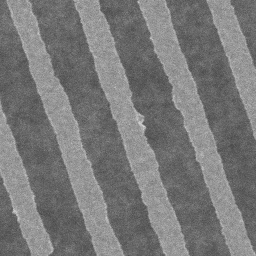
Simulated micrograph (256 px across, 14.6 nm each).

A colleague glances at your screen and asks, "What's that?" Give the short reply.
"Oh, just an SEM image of one or a few lines or trenches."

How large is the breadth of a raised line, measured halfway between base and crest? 0.333 um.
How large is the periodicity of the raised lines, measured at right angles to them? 922 nanometres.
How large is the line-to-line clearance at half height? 582 nm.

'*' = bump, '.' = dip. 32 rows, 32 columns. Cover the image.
.***......**.....****.....***...
.***......***.....***.....***...
..***.....***.....***......***..
..***.....****.....***.....***..
..***......***.....***.....***..
...**......***.....***......***.
...***.....****.....***.....***.
....**......***.....***......**.
....***.....***......**......***
....***.....****.....***.....***
.....***.....***.....***......**
.....***.....***......***.....**
.....***......**......***.....**
......***.....***.....***......*
*.....***.....****.....***.....*
*.....****.....***.....***.....*
*......***.....***......**......
**.....***.....***......***.....
**......**......***.....***.....
**......***.....***......**.....
***.....***.....****.....***....
***......***.....***.....***....
***......***.....***......**....
.***.....***......**......***...
.***.....****.....***.....***...
..**......***.....***......**...
..***.....***......***.....***..
..***......**......***.....***..
...**......***.....***......***.
...***.....***......***.....***.
....**......***.....***.....***.
....**......***......**......***